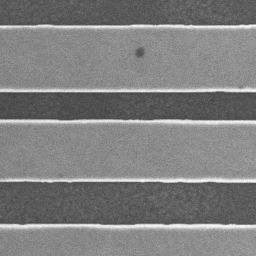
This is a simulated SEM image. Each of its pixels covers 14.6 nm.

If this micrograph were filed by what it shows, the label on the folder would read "lines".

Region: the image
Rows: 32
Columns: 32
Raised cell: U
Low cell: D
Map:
DDDDDDDDDDDDDDDDDDDDDDDDDDDDDDDD
DDDDDDDDDDDDDDDDDDDDDDDDDDDDDDDD
DDDDDDDDDDDDDDDDDDDDDDDDDDDDDDDD
UUUUUUUUUUUUUUUUUUUUUUUUUUUUUUUU
UUUUUUUUUUUUUUUUUUUUUUUUUUUUUUUU
UUUUUUUUUUUUUUUUUUUUUUUUUUUUUUUU
UUUUUUUUUUUUUUUUUUUUUUUUUUUUUUUU
UUUUUUUUUUUUUUUUUUUUUUUUUUUUUUUU
UUUUUUUUUUUUUUUUUUUUUUUUUUUUUUUU
UUUUUUUUUUUUUUUUUUUUUUUUUUUUUUUU
UUUUUUUUUUUUUUUUUUUUUUUUUUUUUUUU
DDDDDDDDDDDDDDDDDDDDDDDDDDDDDDDD
DDDDDDDDDDDDDDDDDDDDDDDDDDDDDDDD
DDDDDDDDDDDDDDDDDDDDDDDDDDDDDDDD
DDDDDDDDDDDDDDDDDDDDDDDDDDDDDDDD
UUUUUUUUUUUUUUUUUUUUUUUUUUUUUUUU
UUUUUUUUUUUUUUUUUUUUUUUUUUUUUUUU
UUUUUUUUUUUUUUUUUUUUUUUUUUUUUUUU
UUUUUUUUUUUUUUUUUUUUUUUUUUUUUUUU
UUUUUUUUUUUUUUUUUUUUUUUUUUUUUUUU
UUUUUUUUUUUUUUUUUUUUUUUUUUUUUUUU
UUUUUUUUUUUUUUUUUUUUUUUUUUUUUUUU
UUUUUUUUUUUUUUUUUUUUUUUUUUUUUUUU
DDDDDDDDDDDDDDDDDDDDDDDDDDDDDDDD
DDDDDDDDDDDDDDDDDDDDDDDDDDDDDDDD
DDDDDDDDDDDDDDDDDDDDDDDDDDDDDDDD
DDDDDDDDDDDDDDDDDDDDDDDDDDDDDDDD
DDDDDDDDDDDDDDDDDDDDDDDDDDDDDDDD
UUUUUUUUUUUUUUUUUUUUUUUUUUUUUUUU
UUUUUUUUUUUUUUUUUUUUUUUUUUUUUUUU
UUUUUUUUUUUUUUUUUUUUUUUUUUUUUUUU
UUUUUUUUUUUUUUUUUUUUUUUUUUUUUUUU